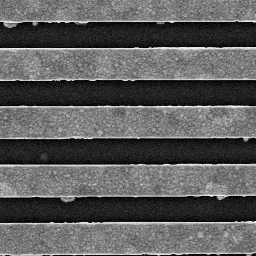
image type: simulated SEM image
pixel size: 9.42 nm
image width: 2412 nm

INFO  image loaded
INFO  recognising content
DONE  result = lines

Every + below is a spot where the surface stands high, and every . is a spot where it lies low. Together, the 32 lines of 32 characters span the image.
++++++++++++++++++++++++++++++++
++++++++++++++++++++++++++++++++
++++++++++++++++++++++++++++++++
................................
................................
................................
++++++++++++++++++++++++++++++++
++++++++++++++++++++++++++++++++
++++++++++++++++++++++++++++++++
++++++++++++++++++++++++++++++++
................................
................................
................................
++++++++++++++++++++++++++++++++
++++++++++++++++++++++++++++++++
++++++++++++++++++++++++++++++++
++++++++++++++++++++++++++++++++
................................
................................
................................
................................
++++++++++++++++++++++++++++++++
++++++++++++++++++++++++++++++++
++++++++++++++++++++++++++++++++
+++++++++++.+...++..............
................................
................................
................................
++++++++++++++++++++++++++++++++
++++++++++++++++++++++++++++++++
++++++++++++++++++++++++++++++++
++++++++++++++++++++++++++++++++